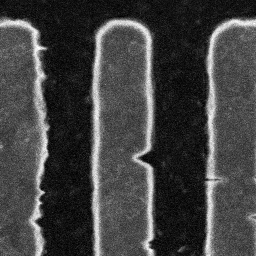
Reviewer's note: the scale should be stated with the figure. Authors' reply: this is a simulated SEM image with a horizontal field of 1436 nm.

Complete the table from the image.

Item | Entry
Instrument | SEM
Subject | one or a few lines or trenches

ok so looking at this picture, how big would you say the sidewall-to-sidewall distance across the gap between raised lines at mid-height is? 328 nanometers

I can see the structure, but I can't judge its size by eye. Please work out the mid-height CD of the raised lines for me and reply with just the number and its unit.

54 px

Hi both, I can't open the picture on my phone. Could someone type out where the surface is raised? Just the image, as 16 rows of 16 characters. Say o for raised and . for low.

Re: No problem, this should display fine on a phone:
................
o......o......oo
oo....ooo....ooo
oo....ooo....ooo
oo....ooo....ooo
oo....ooo....ooo
ooo...ooo....ooo
ooo...ooo....ooo
ooo...ooo....ooo
ooo...ooo....ooo
ooo...ooo....ooo
oo....ooo....ooo
oo....ooo....ooo
oo....ooo....ooo
oo....ooo....ooo
ooo...ooo....ooo